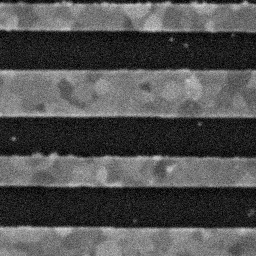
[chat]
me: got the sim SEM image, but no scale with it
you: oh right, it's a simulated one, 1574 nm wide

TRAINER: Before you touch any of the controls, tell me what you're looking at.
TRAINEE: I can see lines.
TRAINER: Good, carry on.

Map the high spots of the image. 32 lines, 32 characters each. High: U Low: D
UDDDDDDDDDDUDDDDDUDDDDDDDDDDDDDD
UUUUUUUUUUUUUUUUUUUUUUUUUUUUUUUU
UUUUUUUUUUUUUUUUUUUUUUUUUUUUUUUU
UUUUUUUUUUUUUUUUUUUUUUUUUUUUUUUU
DDDDDDDDDDDDDDDDDDDDDDDDDDDDDDDD
DDDDDDDDDDDDDDDDDDDDDDDDDDDDDDDD
DDDDDDDDDDDDDDDDDDDDDDDDDDDDDDDD
DDDDDDDDDDDDDDDDDDDDDDDDDDDDDDDD
DDDDDDDDDDDDDDDDDDDDDDDDDDDDDDDD
UUUUUUUUUUUUUUUUUUUUUUUUUUUUUUUU
UUUUUUUUUUUUUUUUUUUUUUUUUUUUUUUU
UUUUUUUUUUUUUUUUUUUUUUUUUUUUUUUU
UUUUUUUUUUUUUUUUUUUUUUUUUUUUUUUU
UUUUUUUUUUUUUUUUUUUUUUUUUUUUUUUU
DDDDDDDDDDDDDDDDDDDDDDDDDUUDDDUU
DDDDDDDDDDDDDDDDDDDDDDDDDDDDDDDD
DDDDDDDDDDDDDDDDDDDDDDDDDDDDDDDD
DDDDDDDDDDDDDDDDDDDDDDDDDDDDDDDD
DDDDDDDDDDDDDDDDDDDDDDDDDDDDDDDD
DDDDDDDDDDDDDDDDDDDDDDDDDDDDDDDD
UUUUUUUUUUUUUUUUUUUUUUUUUUUUUUUU
UUUUUUUUUUUUUUUUUUUUUUUUUUUUUUUU
UUUUUUUUUUUUUUUUUUUUUUUUUUUUUUUU
DDDDDDDDDDDDDDDDDDDDDDDDDDDDDDDD
DDDDDDDDDDDDDDDDDDDDDDDDDDDDDDDD
DDDDDDDDDDDDDDDDDDDDDDDDDDDDDDDD
DDDDDDDDDDDDDDDDDDDDDDDDDDDDDDDD
DDDDDDDDDDDDDDDDDDDDDDDDDDDDDDDD
DDDDDDDDDDDDDDDDDDDDDDDDDDDDDDDD
UUUUUUUUUUUUUUUUUUUUUUUUUUUUUUUU
UUUUUUUUUUUUUUUUUUUUUUUUUUUUUUUU
UUUUUUUUUUUUUUUUUUUUUUUUUUUUUUUU